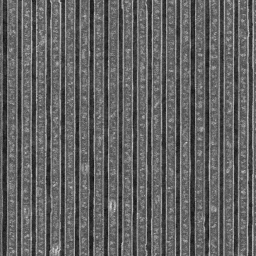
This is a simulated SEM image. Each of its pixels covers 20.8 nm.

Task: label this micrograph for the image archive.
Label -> parallel lines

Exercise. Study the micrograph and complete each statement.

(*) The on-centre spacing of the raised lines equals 0.3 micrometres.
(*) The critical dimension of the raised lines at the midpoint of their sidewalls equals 197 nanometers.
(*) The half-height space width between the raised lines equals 98.7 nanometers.